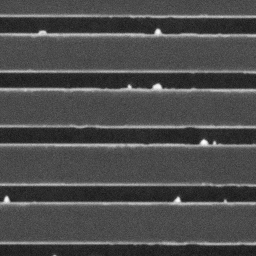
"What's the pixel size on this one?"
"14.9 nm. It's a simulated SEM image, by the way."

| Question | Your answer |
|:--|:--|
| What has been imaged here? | lines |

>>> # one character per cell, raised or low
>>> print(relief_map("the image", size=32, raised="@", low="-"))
@@@@@@@@@@@@@@@@@@@@@@@@@@@@@@@@
@@@@@@@@@@@@@@@@@@@@@@@@@@@@@@@@
--------------------------------
--------------------------------
@@@@@@@@@@@@@@@@@@@@@@@@@@@@@@@@
@@@@@@@@@@@@@@@@@@@@@@@@@@@@@@@@
@@@@@@@@@@@@@@@@@@@@@@@@@@@@@@@@
@@@@@@@@@@@@@@@@@@@@@@@@@@@@@@@@
@@@@@@@@@@@@@@@@@@@@@@@@@@@@@@@@
--------------------------------
--------------------------------
@@@@@@@@@@@@@@@@@@@@@@@@@@@@@@@@
@@@@@@@@@@@@@@@@@@@@@@@@@@@@@@@@
@@@@@@@@@@@@@@@@@@@@@@@@@@@@@@@@
@@@@@@@@@@@@@@@@@@@@@@@@@@@@@@@@
@@@@@@@@@@@@@@@@@@@@@@@@@@@@@@@@
--------------------------------
--------------------------------
@@@@@@@@@@@@@@@@@@@@@@@@@@@@@@@@
@@@@@@@@@@@@@@@@@@@@@@@@@@@@@@@@
@@@@@@@@@@@@@@@@@@@@@@@@@@@@@@@@
@@@@@@@@@@@@@@@@@@@@@@@@@@@@@@@@
@@@@@@@@@@@@@@@@@@@@@@@@@@@@@@@@
--------------------------------
--------------------------------
@@@@@@@@@@@@@@@@@@@@@@@@@@@@@@@@
@@@@@@@@@@@@@@@@@@@@@@@@@@@@@@@@
@@@@@@@@@@@@@@@@@@@@@@@@@@@@@@@@
@@@@@@@@@@@@@@@@@@@@@@@@@@@@@@@@
@@@@@@@@@@@@@@@@@@@@@@@@@@@@@@@@
---------------------@@@--@@@@-@
--------------------------------